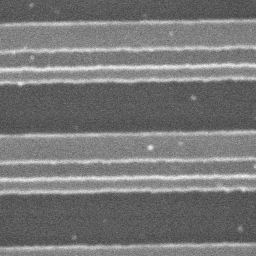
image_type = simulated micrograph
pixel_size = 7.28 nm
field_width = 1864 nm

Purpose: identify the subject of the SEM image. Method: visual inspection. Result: lines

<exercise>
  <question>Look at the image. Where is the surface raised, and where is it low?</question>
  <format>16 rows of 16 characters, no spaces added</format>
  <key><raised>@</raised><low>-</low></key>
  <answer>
----------------
--@@@@@@@@@@@@@@
@@@@@@@@@@@@@@@@
@@@@@@@@@@@@@@@@
@@@@@@@@@@@@@@@@
----------------
----------------
----------------
@@@@@@@@@@@@@@@@
@@@@@@@@@@@@@@@@
@@@@@@@@@@@@@@@@
@@@@@@@@@@@@@@@@
----------------
----------------
----------------
-@@@@@@@@@@@@@@@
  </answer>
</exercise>